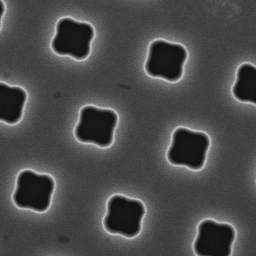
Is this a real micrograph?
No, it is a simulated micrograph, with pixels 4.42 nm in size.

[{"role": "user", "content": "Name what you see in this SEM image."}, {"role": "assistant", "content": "holes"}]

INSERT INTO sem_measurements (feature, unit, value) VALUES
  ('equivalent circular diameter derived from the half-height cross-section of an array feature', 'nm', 171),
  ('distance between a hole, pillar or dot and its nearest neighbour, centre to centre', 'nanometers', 401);